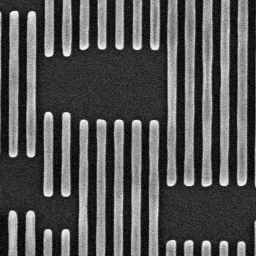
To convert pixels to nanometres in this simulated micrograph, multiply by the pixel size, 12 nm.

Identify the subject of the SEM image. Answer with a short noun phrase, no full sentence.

wiring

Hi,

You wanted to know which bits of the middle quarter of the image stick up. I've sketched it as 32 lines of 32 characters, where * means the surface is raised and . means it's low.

..........................**..**
..........................**..**
..........................**..**
..........................**..**
..........................**..**
..........................**..**
..........................**..**
..........................**..**
..........................**..**
..........................**..**
..........................**..**
..........................**..**
*.........................**..**
*.........................**..**
*...**..**...**..**...*...**..**
*...**..**...**..**...*...**..**
*...**..**...**..**...*...**..**
*...**..**...**..**...*...**..**
*...**..**...**..**..**...**..**
*...**..**...**..**..**...**..**
*...**..**...**..**..**...**..**
*...**..**...**..**..**...**..**
*...**..**...**..**..**...**..**
*...**..**...**..**...*...**..**
*...**..**...**..**...*...**..**
*...**..**...**..**...*...**..**
*...**..**...**..**...*...**..**
*...**..**...**..**..**...**..**
*...**..**...**..**..**...**..**
*...**..**...**..**..**...**..**
*...**..**...**..**..**.........
*...**..**...**..**..**.........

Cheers